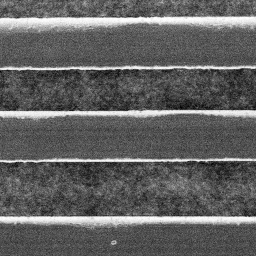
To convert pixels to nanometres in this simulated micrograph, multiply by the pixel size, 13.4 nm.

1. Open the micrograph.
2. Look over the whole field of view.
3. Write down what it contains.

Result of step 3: lines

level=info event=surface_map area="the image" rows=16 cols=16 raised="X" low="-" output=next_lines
----------------
XXXXXXXXXXXXXXXX
XXXXXXXXXXXXXXXX
XXXXXXXXXXXXXXXX
----------------
----------------
----------------
XXXXXXXXXXXXXXXX
XXXXXXXXXXXXXXXX
XXXXXXXXXXXXXXXX
----------------
----------------
----------------
----------------
XXXXXXXXXXXXXXXX
XXXXXXXXXXXXXXXX